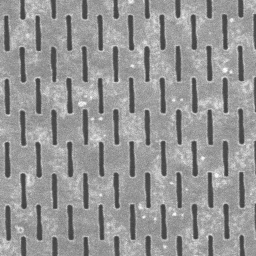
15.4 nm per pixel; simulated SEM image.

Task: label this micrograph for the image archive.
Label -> a regular array of holes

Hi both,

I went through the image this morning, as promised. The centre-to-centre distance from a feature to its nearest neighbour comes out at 0.477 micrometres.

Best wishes